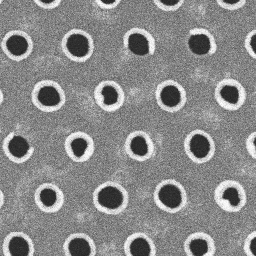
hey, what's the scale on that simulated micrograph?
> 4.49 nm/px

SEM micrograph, a regular array of holes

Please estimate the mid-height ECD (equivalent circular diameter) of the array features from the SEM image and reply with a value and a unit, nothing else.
95.4 nm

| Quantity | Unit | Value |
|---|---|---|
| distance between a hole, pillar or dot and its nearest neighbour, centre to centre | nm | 263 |